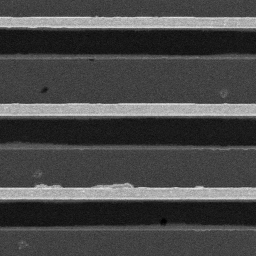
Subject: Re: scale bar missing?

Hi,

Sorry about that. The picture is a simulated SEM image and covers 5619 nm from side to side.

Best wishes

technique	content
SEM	lines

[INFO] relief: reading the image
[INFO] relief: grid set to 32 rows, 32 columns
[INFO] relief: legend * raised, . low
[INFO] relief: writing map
********************************
********************************
********************************
...............................*
................................
................................
................................
********************************
********************************
********************************
********************************
********************************
********************************
********************************
.*..............................
................................
................................
................................
***....*........................
********************************
********************************
********************************
********************************
********************************
********************************
................................
................................
................................
................................
********************************
********************************
********************************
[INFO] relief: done